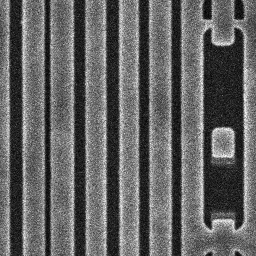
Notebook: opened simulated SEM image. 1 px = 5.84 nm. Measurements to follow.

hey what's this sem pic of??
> parallel lines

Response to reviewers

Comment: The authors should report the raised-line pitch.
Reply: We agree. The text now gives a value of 0.184 um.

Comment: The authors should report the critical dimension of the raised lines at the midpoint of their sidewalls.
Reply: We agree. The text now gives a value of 0.125 um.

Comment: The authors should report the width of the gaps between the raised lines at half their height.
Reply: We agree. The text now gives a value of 12 px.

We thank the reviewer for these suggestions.